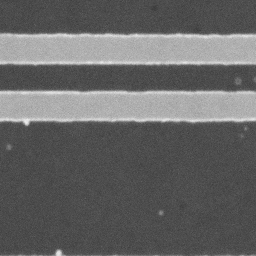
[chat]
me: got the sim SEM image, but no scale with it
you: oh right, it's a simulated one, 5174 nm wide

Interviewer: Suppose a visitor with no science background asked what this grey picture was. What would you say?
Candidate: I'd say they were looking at lines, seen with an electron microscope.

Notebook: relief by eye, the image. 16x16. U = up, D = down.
DDDDDDDDDDDDDDDD
DDDDDDDDDDDDDDDD
UUUUUUUUUUUUUUUU
UUUUUUUUUUUUUUUU
DDDDDDDDDDDDDDDD
DDDDDDDDDDDDDDDD
UUUUUUUUUUUUUUUU
UUUUUUUUUUUUUUUU
DDDDDDDDDDDDDDDD
DDDDDDDDDDDDDDDD
DDDDDDDDDDDDDDDD
DDDDDDDDDDDDDDDD
DDDDDDDDDDDDDDDD
DDDDDDDDDDDDDDDD
DDDDDDDDDDDDDDDD
DDDDDDDDDDDDDDDD